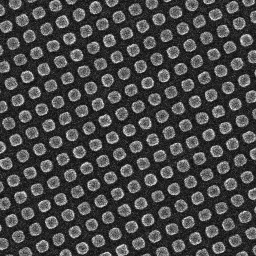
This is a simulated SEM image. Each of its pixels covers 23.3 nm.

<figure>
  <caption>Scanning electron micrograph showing a regular array of raised bodies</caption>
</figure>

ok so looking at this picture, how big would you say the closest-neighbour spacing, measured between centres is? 412 nm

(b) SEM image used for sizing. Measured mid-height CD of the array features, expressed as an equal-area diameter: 284 nanometers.